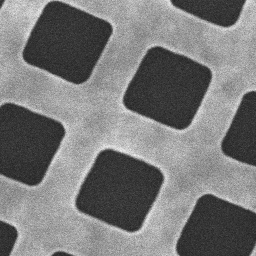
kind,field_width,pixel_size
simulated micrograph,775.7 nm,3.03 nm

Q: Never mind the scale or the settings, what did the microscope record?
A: holes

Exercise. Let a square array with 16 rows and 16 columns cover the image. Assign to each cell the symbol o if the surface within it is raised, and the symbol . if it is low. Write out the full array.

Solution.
ooo..oooooo....o
oo.....oooooo..o
oo.....ooooooooo
o.....ooo..ooooo
ooo...oo.....ooo
oooooooo.....ooo
.ooooooo.....oo.
...ooooooo..ooo.
....oooooooooo..
....oo..oooooo..
...ooo....oooooo
o.ooo.....oooooo
ooooo.....oo..oo
oooooo...ooo....
.oooooooooo.....
.oooooooooo.....